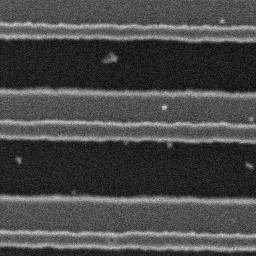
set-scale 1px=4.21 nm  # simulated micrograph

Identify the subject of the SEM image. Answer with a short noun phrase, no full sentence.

lines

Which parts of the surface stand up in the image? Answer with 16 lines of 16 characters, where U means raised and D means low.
UUUUUUUUUUUUUUUU
UUUUUUUUUUUUUUUU
DDDDDDDDDDDUUUUU
DDDDDDDDDDDDDDDD
DDDDDDDDDDDDDDDD
DDDDDDDDDDDDDDDD
UUUUUUUUUUUUUUUU
UUUUUUUUUUUUUUUU
UUUUUUUUUUUUUUUU
DDDDDDDDDDDDDDDD
DDDDDDDDDDDDDDDD
DDDDDDDDDDDDDDDD
UUUUUUUDDDDDDDDD
UUUUUUUUUUUUUUUU
UUUUUUUUUUUUUUUU
DDDDDDDDDUUUUUUU